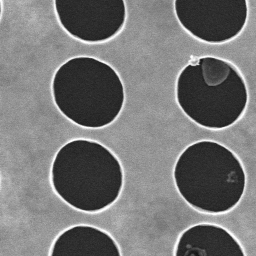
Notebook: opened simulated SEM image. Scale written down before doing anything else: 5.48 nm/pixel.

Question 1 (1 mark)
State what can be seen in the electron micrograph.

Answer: holes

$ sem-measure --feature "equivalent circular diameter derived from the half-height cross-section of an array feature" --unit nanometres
384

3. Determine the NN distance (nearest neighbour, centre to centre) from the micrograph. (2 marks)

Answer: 0.46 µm